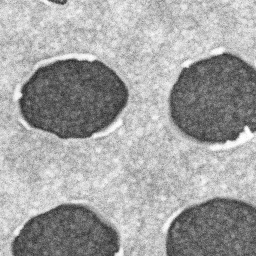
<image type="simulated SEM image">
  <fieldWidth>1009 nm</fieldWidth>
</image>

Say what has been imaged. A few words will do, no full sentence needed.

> holes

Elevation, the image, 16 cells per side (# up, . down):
################
################
################
#############..#
##.....####.....
#.......###.....
#.......###.....
##.....####.....
####..######...#
################
################
################
#############..#
##....#####.....
#......###......
#......###......